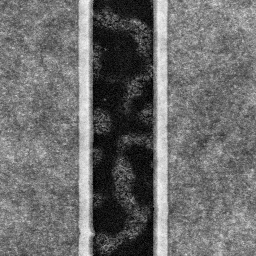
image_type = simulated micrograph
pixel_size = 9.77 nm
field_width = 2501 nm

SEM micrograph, one or a few lines or trenches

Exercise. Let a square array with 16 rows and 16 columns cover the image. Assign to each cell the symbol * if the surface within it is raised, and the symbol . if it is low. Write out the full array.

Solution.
*****.....******
*****.....******
*****.....******
*****.....******
*****.....******
*****.....******
*****.....******
*****.....******
*****.....******
*****.....******
*****.....******
*****.....******
*****.....******
*****.....******
*****.....******
*****.....******